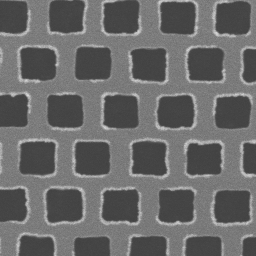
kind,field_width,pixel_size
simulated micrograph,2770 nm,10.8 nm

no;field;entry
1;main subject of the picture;a regular array of holes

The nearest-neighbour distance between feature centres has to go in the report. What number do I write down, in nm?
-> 589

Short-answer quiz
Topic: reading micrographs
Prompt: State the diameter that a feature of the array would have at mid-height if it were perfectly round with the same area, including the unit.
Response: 37.5 px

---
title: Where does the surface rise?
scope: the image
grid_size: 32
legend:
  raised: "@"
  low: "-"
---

---@@@-----@@----@@@----@@@----@
---@@@----@@@----@@@----@@@----@
---@@@----@@@----@@@----@@@----@
---@@@----@@@----@@@----@@@----@
@@@@@@@@@@@@@@@@@@@@@@@@@@@@@@@@
@@@@@@@@@@@@@@@@@@@@@@@@@@@@@@@@
@@@----@@@----@@-----@@@----@@--
@@@----@@-----@@@----@@-----@@--
@@@----@@-----@@@----@@@----@@--
@@@----@@@----@@@----@@@----@@--
@@@@@@@@@@@@@@@@@@@@@@@@@@@@@@@@
@@@@@@@@@@@@@@@@@@@@@@@@@@@@@@@@
----@@----@@@----@@@----@@@----@
----@@----@@@----@@@----@@@----@
----@@----@@@----@@@----@@@----@
---@@@----@@@----@@@----@@@----@
@@@@@@@@@@@@@@@@@@@@@@@@@@@@@@@@
@@@@@@@@@@@@@@@@@@@@@@@@@@@@@@@@
@@@----@@-----@@-----@@-----@@--
@@@----@@-----@@@----@@-----@@--
@@-----@@-----@@@----@@-----@@--
@@@----@@@----@@@----@@@---@@@@-
@@@@@@@@@@@@@@@@@@@@@@@@@@@@@@@@
@@@@@@@@@@@@@@@@@@@@@@@@@@@@@@@@
---@@@----@@@----@@@----@@@----@
---@@@----@@@----@@@----@@@----@
---@@@----@@@----@@@----@@@----@
---@@@----@@@----@@@----@@@----@
@@@@@@@@@@@@@@@@@@@@@@@@@@@@@@@@
@@@-@@@@@@@@@@@@@@@-@@@@@@@@@@@@
@@-----@@-----@@-----@@-----@@--
@@-----@@-----@@-----@@-----@@--